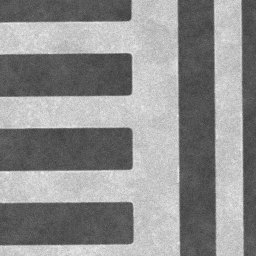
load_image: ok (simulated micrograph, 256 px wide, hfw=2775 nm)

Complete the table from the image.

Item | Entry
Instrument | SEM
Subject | groups of lines, slits or small figures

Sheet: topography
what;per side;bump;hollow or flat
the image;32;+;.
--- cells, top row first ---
.................+++++.....+++..
.................+++++.....+++..
................++++++.....+++..
++++++++++++++++++++++.....+++..
++++++++++++++++++++++.....+++..
++++++++++++++++++++++.....+++..
++++++++++++++++++++++.....+++..
.................+++++.....+++..
.................+++++.....+++..
.................+++++.....+++..
.................+++++.....+++..
.................+++++.....+++..
++++++++++++++++++++++.....+++..
++++++++++++++++++++++.....+++..
++++++++++++++++++++++.....+++..
++++++++++++++++++++++.....+++..
.................+++++.....+++..
.................+++++.....+++..
.................+++++.....+++..
.................+++++.....+++..
.................+++++.....+++..
..++++++++++++++++++++.....+++..
++++++++++++++++++++++.....+++..
++++++++++++++++++++++.....+++..
++++++++++++++++++++++.....+++..
.................+++++.....+++..
.................+++++.....+++..
.................+++++.....+++..
.................+++++.....+++..
.................+++++.....+++..
................++++++.....+++..
++++++++++++++++++++++.....+++..